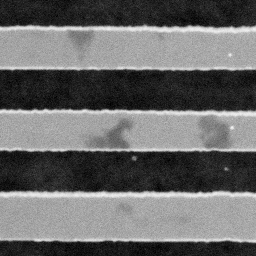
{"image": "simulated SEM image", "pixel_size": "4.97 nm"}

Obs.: lines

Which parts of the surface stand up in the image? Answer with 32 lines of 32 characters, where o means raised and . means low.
................................
................................
................................
ooooooooooooooooooooooooooo.o.oo
oooooooooooooooooooooooooooooooo
oooooooooooooooooooooooooooooooo
oooooooooooooooooooooooooooooooo
oooooooooooooooooooooooooooooooo
oooooooooooooooooooooooooooooooo
................................
................................
................................
................................
................................
oooooooooooooooooooooooooooooooo
oooooooooooooooooooooooooooooooo
oooooooooooooooooooooooooooooooo
oooooooooooooooooooooooooooooooo
oooooooooooooooooooooooooooooooo
................................
................................
................................
................................
................................
oooooooooooooooooooooooooooooooo
oooooooooooooooooooooooooooooooo
oooooooooooooooooooooooooooooooo
oooooooooooooooooooooooooooooooo
oooooooooooooooooooooooooooooooo
oooooooooooooooooooooooooooooooo
................................
................................